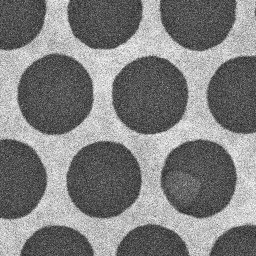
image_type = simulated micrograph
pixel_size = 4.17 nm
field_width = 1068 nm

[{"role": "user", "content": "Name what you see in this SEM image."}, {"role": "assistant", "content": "holes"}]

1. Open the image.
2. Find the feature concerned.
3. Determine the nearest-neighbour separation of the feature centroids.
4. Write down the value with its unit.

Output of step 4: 0.395 um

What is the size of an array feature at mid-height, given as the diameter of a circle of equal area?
323 nanometres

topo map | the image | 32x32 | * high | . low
......***.........**..........**
......**..........**..........**
......***.........**.........***
.....****........****........***
.....****........****.......****
...********....*******.....*****
********************************
*****....********....*******....
***........****.......*****.....
***........****........****.....
**..........**.........***......
**..........**.........***......
**..........**.........***......
**.........***.........***......
***........****........****.....
****......*****.......*****.....
*****...*********...*********...
..***********************.******
....******......******......****
.....****........****........***
.....****........****........***
......**..........**..........**
......**..........**..........**
......**..........**.........***
.....****........****........***
.....****........****........***
....******.....*******.....*****
********************************
*****....********....********...
****......******......******....
***........****........****.....
***.........***.........**......